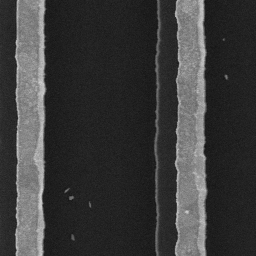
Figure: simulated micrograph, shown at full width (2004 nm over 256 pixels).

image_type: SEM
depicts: lines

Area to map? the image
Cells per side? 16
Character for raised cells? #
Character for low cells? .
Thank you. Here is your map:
###.......###...
###.......###...
###.......###...
###.......###...
###.......###...
###.......###...
###.......###...
###.......###...
###.......###...
###.......###...
###.......###...
###.......###...
###.......###...
###.......###...
###.......###...
###.......###...